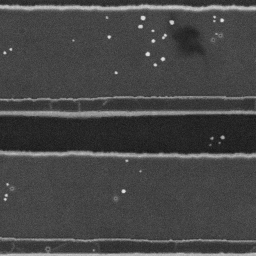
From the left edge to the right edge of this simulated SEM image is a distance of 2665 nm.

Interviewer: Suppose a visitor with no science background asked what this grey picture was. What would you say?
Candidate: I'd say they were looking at lines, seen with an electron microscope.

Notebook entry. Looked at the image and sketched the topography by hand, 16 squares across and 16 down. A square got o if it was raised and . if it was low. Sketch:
o.......ooo..o..
oooooooooooooooo
oooooooooooooooo
oooooooooooooooo
oooooooooooooooo
oooooooooooooooo
oooooooooooooooo
................
................
................
oooooooooooooooo
oooooooooooooooo
oooooooooooooooo
oooooooooooooooo
oooooooooooooooo
oooooooooooooooo